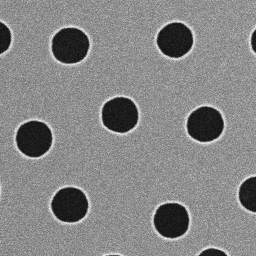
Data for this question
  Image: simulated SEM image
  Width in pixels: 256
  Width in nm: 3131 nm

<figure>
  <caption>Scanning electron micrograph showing holes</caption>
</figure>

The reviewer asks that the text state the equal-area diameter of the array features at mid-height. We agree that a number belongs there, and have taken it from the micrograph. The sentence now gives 445 nanometers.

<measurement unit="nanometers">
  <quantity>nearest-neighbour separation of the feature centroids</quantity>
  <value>1040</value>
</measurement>